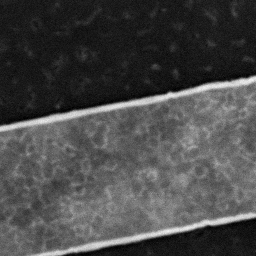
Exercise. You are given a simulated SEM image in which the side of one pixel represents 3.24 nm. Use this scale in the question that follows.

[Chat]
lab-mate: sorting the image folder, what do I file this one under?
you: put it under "one or a few lines or trenches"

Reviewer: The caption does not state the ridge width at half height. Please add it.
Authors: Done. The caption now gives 429 nm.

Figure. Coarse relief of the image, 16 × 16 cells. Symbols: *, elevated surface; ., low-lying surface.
................
................
................
................
................
.............***
........********
...*************
****************
****************
****************
****************
****************
****************
**********......
*****...........